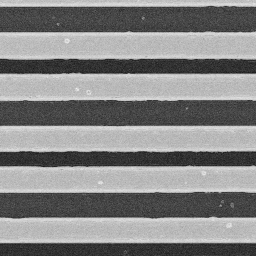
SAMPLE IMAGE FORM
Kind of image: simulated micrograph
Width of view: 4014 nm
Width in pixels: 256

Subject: lines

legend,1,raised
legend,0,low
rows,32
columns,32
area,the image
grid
11111111111111111111111111111111
00000000000000000000000000000000
00000000000000000000000000000000
00000000000000000000000000000000
11111111111111111111111111111111
11111111111111111111111111111111
11111111111111111111111111111111
00000000000000000000000000000000
00000000000000000000000000000000
11111111111111111111111111111111
11111111111111111111111111111111
11111111111111111111111111111111
00011000000000000000000000000000
00000000000000000000000000000000
00000000000000000000000000000000
00000000000000000000000000000000
11111111111111111111111111111111
11111111111111111111111111111111
11111111111111111111111111111111
00000000000000000000000000000000
00000000000000000000000000000000
11111111111111111111111111111111
11111111111111111111111111111111
11111111111111111111111111111111
00000000000000000000000000000000
00000000000000000000000000000000
00000000000000000000000000000000
11111111111111111111111111111111
11111111111111111111111111111111
11111111111111111111111111111111
00000000000000000000000000000000
00000000000000000000000000000000